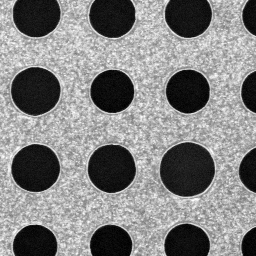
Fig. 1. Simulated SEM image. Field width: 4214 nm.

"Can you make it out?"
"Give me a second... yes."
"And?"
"holes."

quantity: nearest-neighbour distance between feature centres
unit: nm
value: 1240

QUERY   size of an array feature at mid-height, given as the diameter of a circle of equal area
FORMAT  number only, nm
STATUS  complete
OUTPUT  804